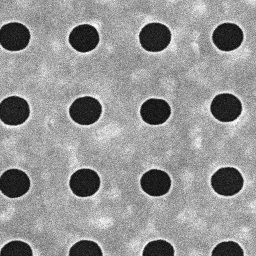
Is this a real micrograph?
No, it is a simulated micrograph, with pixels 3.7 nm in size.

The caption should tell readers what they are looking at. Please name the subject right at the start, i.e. a regular array of holes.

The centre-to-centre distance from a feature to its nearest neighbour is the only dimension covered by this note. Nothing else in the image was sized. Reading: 263 nanometers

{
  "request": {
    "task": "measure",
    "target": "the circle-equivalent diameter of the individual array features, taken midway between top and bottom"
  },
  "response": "112 nanometers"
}